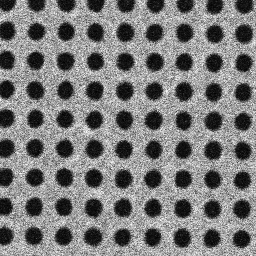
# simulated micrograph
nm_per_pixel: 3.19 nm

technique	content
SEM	a regular array of holes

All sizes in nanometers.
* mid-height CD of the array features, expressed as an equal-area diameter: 55.1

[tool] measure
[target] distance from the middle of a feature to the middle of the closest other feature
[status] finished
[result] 29.1 px